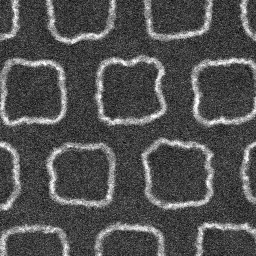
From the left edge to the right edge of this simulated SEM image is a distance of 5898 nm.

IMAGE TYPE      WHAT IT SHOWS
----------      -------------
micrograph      raised bodies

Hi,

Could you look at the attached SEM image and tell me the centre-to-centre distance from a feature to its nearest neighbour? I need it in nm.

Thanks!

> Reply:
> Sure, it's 2210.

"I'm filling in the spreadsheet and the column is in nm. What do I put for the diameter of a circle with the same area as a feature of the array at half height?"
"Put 1560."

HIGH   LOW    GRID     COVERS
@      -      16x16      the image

@--@@@@--@@@@--@
@--@@@@--@@@@--@
----------------
----------------
@@@@--@@@@--@@@@
@@@@--@@@@--@@@@
@@@@--@@@@--@@@@
-@@----@@----@@-
----------------
@---@@@--@@@@---
@--@@@@--@@@@--@
@--@@@@--@@@@--@
@---@@@---@@@---
----------------
-@@----@@@---@@@
@@@@--@@@@--@@@@